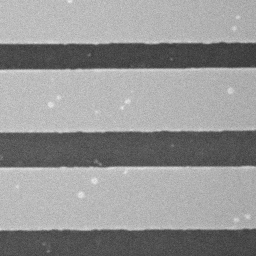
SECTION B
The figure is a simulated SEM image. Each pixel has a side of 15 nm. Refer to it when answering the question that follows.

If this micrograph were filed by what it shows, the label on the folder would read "lines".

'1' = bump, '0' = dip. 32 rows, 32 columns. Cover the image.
11111111111111111111111111111111
11111111111111111111111111111111
11111111111111111111111111111111
11111111111111111111111111111111
11111111111111111111111111111111
00000000000110000000000000000000
00000000000000000000000000000000
00000000000000000000000000000000
00000000000000000000000000000000
11111111111111111111111111111111
11111111111111111111111111111111
11111111111111111111111111111111
11111111111111111111111111111111
11111111111111111111111111111111
11111111111111111111111111111111
11111111111111111111111111111111
00000001000000000000000000000000
00000000000000000000000000000000
00000000000000000000000000000000
00000000000000000000000000000000
00000000000000000000000000000000
11111111111111111111111111111111
11111111111111111111111111111111
11111111111111111111111111111111
11111111111111111111111111111111
11111111111111111111111111111111
11111111111111111111111111111111
11111111111111111111111111111111
11111111111111111111111111111111
00000000000000000000000000000000
00000000000000000000000000000000
00000000000000000000000000000000